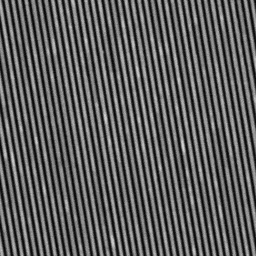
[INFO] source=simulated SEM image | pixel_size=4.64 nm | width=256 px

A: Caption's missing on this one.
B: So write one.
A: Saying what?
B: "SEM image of parallel lines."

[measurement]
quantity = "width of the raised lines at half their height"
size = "16 nm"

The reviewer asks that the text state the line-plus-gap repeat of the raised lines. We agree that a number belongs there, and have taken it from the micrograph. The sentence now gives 30.4 nm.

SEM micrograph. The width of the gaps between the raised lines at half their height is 16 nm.